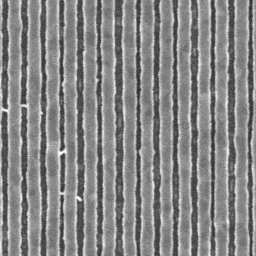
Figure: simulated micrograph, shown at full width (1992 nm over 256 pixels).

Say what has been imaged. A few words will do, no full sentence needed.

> parallel lines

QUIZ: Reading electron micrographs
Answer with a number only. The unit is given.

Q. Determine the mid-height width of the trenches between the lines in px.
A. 6.75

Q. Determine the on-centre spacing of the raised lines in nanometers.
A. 147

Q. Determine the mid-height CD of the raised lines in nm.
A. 98.2